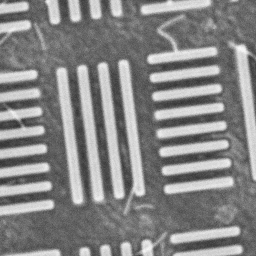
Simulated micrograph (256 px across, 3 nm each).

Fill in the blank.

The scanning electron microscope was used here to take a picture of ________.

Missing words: groups of lines, slits or small figures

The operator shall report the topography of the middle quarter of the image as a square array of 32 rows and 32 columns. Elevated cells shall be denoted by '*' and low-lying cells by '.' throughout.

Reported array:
....*....**...**................
...***...**...**.............***
*..***...**...**......**********
*...**...**...**......*********.
*...**...**...***...............
*...**...**...***...............
*...**...***...**..........*****
*...**...***...**.....**********
**..***...**...**.....*******...
**..***...**...**...............
**...**...**...***..............
**...**...**...***.......*******
**...**...**...***.....*********
**...**...***..***.....****.....
**...**...***...**..............
**...***..***...**..............
**...***...**...**......********
***..***...**...**.....*********
***...**...**...**..............
***...**...**...***.............
.**...**...**...***.........****
.**...**...***..***.....********
.**...**...***..***.....******..
.**...***..***...**.............
.**...***..***...**.............
.***...**...**...**.......******
.***...**...**...**......*******
..**...**...**...***.....***....
..**...**...**...***............
..**...**...***..***............
..**...***..***..***.....*******
..**...***..***..***.....*******